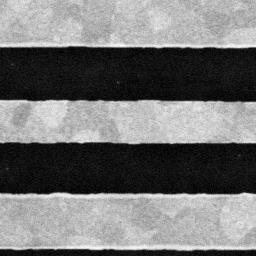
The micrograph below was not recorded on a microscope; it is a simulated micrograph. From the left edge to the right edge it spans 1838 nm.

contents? lines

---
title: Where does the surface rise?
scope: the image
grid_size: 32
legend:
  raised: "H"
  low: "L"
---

HHHHHHHHHHHHHHHHHHHHHHHHHHHHHHHH
HHHHHHHHHHHHHHHHHHHHHHHHHHHHHHHH
HHHHHHHHHHHHHHHHHHHHHHHHHHHHHHHH
HHHHHHHHHHHHHHHHHHHHHHHHHHHHHHHH
HHHHHHHHHHHHHHHHHHHHHHHHHHHHHHHH
HHHHHHHHHHHHHHHHHHHHHHHHHHHHHHHH
LLLLLLLLLLLLLLLLLLLLLLLLLLLLLLLL
LLLLLLLLLLLLLLLLLLLLLLLLLLLLLLLL
LLLLLLLLLLLLLLLLLLLLLLLLLLLLLLLL
LLLLLLLLLLLLLLLLLLLLLLLLLLLLLLLL
LLLLLLLLLLLLLLLLLLLLLLLLLLLLLLLL
LLLLLLLLLLLLLLLLLLLLLLLLLLLLLLLL
LLLLLLLLLLLLLLLLLLLLLLLLLLLLLLLL
HHHHHHHHHHHHHHHHHHHHHHHHHHHHHHHH
HHHHHHHHHHHHHHHHHHHHHHHHHHHHHHHH
HHHHHHHHHHHHHHHHHHHHHHHHHHHHHHHH
HHHHHHHHHHHHHHHHHHHHHHHHHHHHHHHH
HHHHHHHHHHHHHHHHHHHHHHHHHHHHHHHH
LLLLLLLLLLLLLLLLLLLLLLLLLLLLLLLL
LLLLLLLLLLLLLLLLLLLLLLLLLLLLLLLL
LLLLLLLLLLLLLLLLLLLLLLLLLLLLLLLL
LLLLLLLLLLLLLLLLLLLLLLLLLLLLLLLL
LLLLLLLLLLLLLLLLLLLLLLLLLLLLLLLL
LLLLLLLLLLLLLLLLLLLLLLLLLLLLLLLL
HHHHHHHHHHHHHHHHHHHHHHHHHHHHHHHH
HHHHHHHHHHHHHHHHHHHHHHHHHHHHHHHH
HHHHHHHHHHHHHHHHHHHHHHHHHHHHHHHH
HHHHHHHHHHHHHHHHHHHHHHHHHHHHHHHH
HHHHHHHHHHHHHHHHHHHHHHHHHHHHHHHH
HHHHHHHHHHHHHHHHHHHHHHHHHHHHHHHH
HHHHHHHHHHHHHHHHHHHHHHHHHHHHHHHH
LLLLLLLLLLLLLLLLLLLLLLLLLLLLLLLL